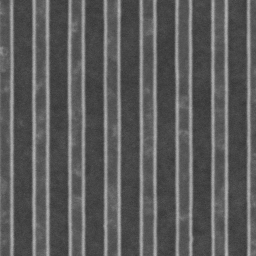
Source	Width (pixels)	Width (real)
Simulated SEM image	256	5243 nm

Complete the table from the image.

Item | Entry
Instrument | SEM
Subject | parallel lines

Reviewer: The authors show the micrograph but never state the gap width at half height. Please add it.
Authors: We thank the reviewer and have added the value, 435 nm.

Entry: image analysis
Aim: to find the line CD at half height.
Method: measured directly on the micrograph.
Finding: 300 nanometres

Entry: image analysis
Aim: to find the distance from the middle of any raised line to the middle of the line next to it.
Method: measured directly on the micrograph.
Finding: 0.733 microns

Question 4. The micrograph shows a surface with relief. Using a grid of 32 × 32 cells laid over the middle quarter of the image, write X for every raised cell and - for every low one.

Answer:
-XXXX-----XXXX-----XXXX-----XXXX
-XXXX-----XXXX-----XXXX-----XXXX
-XXXX-----XXXX-----XXXX-----XXXX
-XXXX-----XXXX-----XXXX-----XXXX
-XXXX-----XXXX-----XXXX-----XXXX
-XXXX-----XXXX-----XXXX-----XXXX
-XXXX-----XXXX-----XXXX-----XXXX
-XXXX-----XXXX-----XXXX-----XXXX
-XXXX-----XXXX-----XXXX-----XXXX
-XXXX-----XXXX-----XXXX-----XXXX
-XXXX-----XXXX-----XXXX-----XXXX
-XXXX-----XXXX-----XXXX-----XXXX
-XXXX-----XXXX-----XXXX-----XXXX
-XXXX-----XXXX-----XXXX-----XXXX
-XXXX-----XXXX-----XXXX-----XXXX
-XXXX-----XXXX-----XXXX-----XXXX
-XXXX-----XXXX-----XXXX-----XXXX
-XXXX-----XXXX-----XXXX-----XXXX
-XXXX-----XXXX-----XXXX-----XXXX
-XXXX-----XXXX-----XXXX-----XXXX
-XXXX-----XXXX-----XXXX-----XXXX
-XXXX-----XXXX-----XXXX-----XXXX
-XXXX-----XXXX-----XXXX-----XXXX
-XXXX-----XXXX-----XXXX-----XXXX
-XXXX-----XXXX-----XXXX-----XXXX
-XXXX-----XXXX-----XXXX-----XXXX
-XXXX-----XXXX-----XXXX-----XXXX
-XXXX-----XXXX-----XXXX-----XXXX
-XXXX-----XXXX-----XXXX-----XXXX
-XXXX-----XXXX-----XXXX-----XXXX
-XXXX-----XXXX-----XXXX-----XXXX
-XXXX-----XXXX-----XXXX-----XXXX